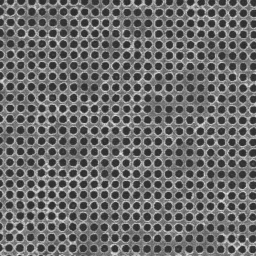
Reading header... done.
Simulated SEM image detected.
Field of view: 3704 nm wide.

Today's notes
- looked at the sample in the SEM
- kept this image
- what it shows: a regular array of holes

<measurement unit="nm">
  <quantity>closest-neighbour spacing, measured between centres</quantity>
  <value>150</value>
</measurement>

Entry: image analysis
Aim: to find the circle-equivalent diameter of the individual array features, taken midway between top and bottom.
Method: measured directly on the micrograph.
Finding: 115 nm